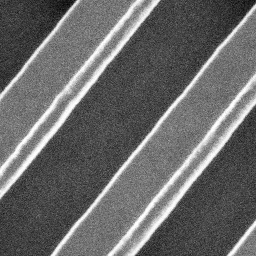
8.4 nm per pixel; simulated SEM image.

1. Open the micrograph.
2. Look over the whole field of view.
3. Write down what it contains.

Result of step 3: lines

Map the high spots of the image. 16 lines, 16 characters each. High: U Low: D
DDDDUUUUUDDDDDDD
DDDDUUUUUDDDDDDU
DDDUUUUUDDDDDDUU
DDUUUUUDDDDDDUUU
DUUUUUDDDDDDDUUU
UUUUUUDDDDDDUUUU
UUUUUDDDDDDUUUUU
UUUUDDDDDDUUUUUD
UUUDDDDDDUUUUUDD
UUDDDDDDDUUUUUDD
UDDDDDDDUUUUUDDD
UDDDDDDUUUUUDDDD
DDDDDDUUUUUDDDDD
DDDDDUUUUUDDDDDD
DDDDUUUUUDDDDDDD
DDDDUUUUUDDDDDDU